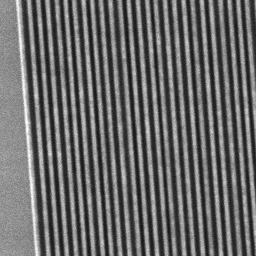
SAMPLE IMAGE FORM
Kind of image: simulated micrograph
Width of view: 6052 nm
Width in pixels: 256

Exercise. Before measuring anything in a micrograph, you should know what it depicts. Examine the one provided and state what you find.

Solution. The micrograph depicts parallel lines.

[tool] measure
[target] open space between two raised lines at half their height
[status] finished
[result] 127 nm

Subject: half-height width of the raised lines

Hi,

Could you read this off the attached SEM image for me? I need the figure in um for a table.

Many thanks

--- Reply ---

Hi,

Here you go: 0.0855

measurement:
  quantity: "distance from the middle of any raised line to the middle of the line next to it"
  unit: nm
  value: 215